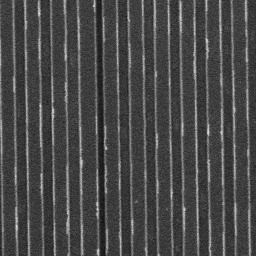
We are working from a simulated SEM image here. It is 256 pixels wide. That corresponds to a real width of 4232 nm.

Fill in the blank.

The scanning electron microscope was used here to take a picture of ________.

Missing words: parallel lines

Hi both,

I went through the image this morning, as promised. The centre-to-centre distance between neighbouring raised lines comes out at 427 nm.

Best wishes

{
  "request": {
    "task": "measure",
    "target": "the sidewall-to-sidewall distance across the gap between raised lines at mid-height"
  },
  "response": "176 nanometres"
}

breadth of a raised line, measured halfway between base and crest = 250 nm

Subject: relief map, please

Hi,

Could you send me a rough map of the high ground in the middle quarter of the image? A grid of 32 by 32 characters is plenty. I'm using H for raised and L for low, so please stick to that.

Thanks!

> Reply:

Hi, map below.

HLLLHHHHLLHHHLLLHHHHLLLHHHLLLHHH
HLLLHHHHLLHHHLLLHHHHLLLHHHLLLHHH
HLLLHHHHLLHHHLLLHHHHLLLHHHLLLHHH
HLLLHHHHLLHHHLLLHHHHLLLHHHLLLHHH
HLLLHHHHLLHHHLLLHHHHLLLHHHLLLHHH
HLLLHHHHLLHHHLLLHHHHLLLHHHLLLHHH
HLLLHHHHLLHHHHLLHHHHLLLHHHLLLHHH
HLLLHHHHLLHHHHLLHHHHLLLHHHLLLHHH
HLLLHHHHLLHHHHLLHHHHLLLHHHLLLHHH
HLLLHHHHLLHHHHLLHHHHLLLHHHLLLHHH
HLLLHHHHLLHHHHLLHHHHLLLHHHLLLHHH
HLLLHHHHLLHHHHLLHHHHLLLHHHLLLHHH
HLLLHHHHLLHHHHLLLHHHLLLHHHLLLHHH
HLLLHHHHLLHHHHLLLHHHLLLHHHHLLHHH
HLLLHHHHLLHHHHLLLHHHLLLHHHHLLHHH
HLLLHHHHLLHHHHLLLHHHLLLHHHHLLHHH
HLLLHHHHLLHHHHLLLHHHLLLHHHHLLHHH
HLLLHHHHLLHHHHLLLHHHLLLHHHHLLHHH
HLLLHHHHLLHHHHLLLHHHLLLHHHHLLHHH
HLLLHHHHLLHHHHLLLHHHLLLHHHHLLLHH
HLLLHHHHLLHHHHLLLHHHLLLHHHHLLLHH
HLLLHHHHLLHHHHLLLHHHLLLHHHHLLLHH
HLLLHHHHLLHHHHLLLHHHLLLHHHHLLLHH
HLLLHHHHLLHHHHLLLHHHLLLHHHHLLLHH
HLLLHHHHLLHHHHLLLHHHLLLHHHHLLLHH
HLLLHHHHLLHHHHLLLHHHLLLHHHHLLLHH
HLLLHHHHLLHHHHLLLHHHLLLHHHHLLLHH
HLLLHHHHHLHHHHLLLHHHLLLHHHHLLLHH
HLLLHHHHHLHHHHLLLHHHHLLHHHHLLLHH
HLLLHHHHHLHHHHLLLHHHLLLHHHHLLLHH
HLLLHHHHHLHHHHLLLHHHLLLHHHHLLLHH
HLLLHHHHHLHHHHLLLHHHLLLHHHHLLLHH